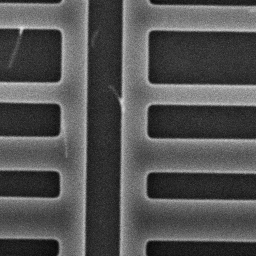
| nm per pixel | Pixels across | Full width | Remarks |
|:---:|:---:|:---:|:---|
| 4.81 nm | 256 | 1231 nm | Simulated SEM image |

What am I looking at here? groups of lines, slits or small figures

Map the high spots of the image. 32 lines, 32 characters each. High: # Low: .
.......####.....###.............
###########.....################
###########.....################
..#########....#################
........###....####.............
........###....###..............
........###....###..............
........###....###..............
........###....###..............
........###....###..............
###########....####.............
###########....#################
###########....#################
........###....####.............
........###....###..............
........###....###..............
........###....###..............
###########....#################
###########....#################
###########....#################
###########....#################
.......####....####........#####
........###....###..............
........###....###..............
.......####....###..............
###########....#################
###########....#################
###########....#################
###########....#################
###########....#################
.......####....###..............
.......###.....###..............